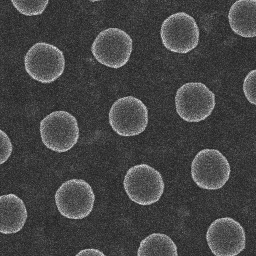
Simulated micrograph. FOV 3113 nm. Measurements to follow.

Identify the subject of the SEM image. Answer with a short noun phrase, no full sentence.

a regular array of raised bodies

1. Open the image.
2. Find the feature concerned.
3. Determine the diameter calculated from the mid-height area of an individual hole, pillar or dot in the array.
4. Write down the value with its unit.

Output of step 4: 477 nanometers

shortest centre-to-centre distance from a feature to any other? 840 nm